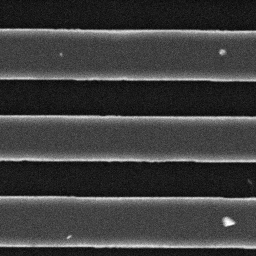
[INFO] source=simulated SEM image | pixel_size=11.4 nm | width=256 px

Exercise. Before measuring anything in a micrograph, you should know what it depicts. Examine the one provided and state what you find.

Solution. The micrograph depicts lines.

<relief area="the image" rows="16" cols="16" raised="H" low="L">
LLLLLLLLLLLLLLLL
LLLLLLLLLLLLLLLL
HHHHHHHHHHHHHHHH
HHHHHHHHHHHHHHHH
HHHHHHHHHHHHHHHH
LLLLLLLLLLLLLLLL
LLLLLLLLLLLLLLLL
HHHHHHHHHHHHHHHH
HHHHHHHHHHHHHHHH
HHHHHHHHHHHHHHHH
LLLLLLLLLLLLLLLL
LLLLLLLLLLLLLLLL
HHHHHHHHHHHHHHHH
HHHHHHHHHHHHHHHH
HHHHHHHHHHHHHHHH
LLLLLLLLLLLLLLLH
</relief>